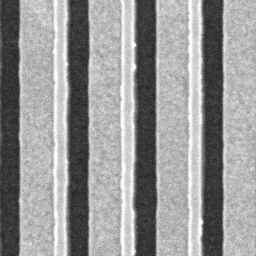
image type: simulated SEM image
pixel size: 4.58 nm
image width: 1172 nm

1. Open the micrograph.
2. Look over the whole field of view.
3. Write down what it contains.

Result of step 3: lines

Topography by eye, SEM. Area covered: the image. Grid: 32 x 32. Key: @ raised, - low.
---@@@@@---@@@@@@---@@@@@---@@@@
---@@@@@---@@@@@@---@@@@@---@@@@
---@@@@@---@@@@@@---@@@@@---@@@@
---@@@@@---@@@@@@---@@@@@---@@@@
--@@@@@@---@@@@@@---@@@@@---@@@@
--@@@@@@---@@@@@@---@@@@@---@@@@
---@@@@@---@@@@@@---@@@@@---@@@@
---@@@@@---@@@@@@---@@@@@---@@@@
--@@@@@@---@@@@@@---@@@@@---@@@@
--@@@@@@---@@@@@@---@@@@@---@@@@
---@@@@@---@@@@@@---@@@@@---@@@@
---@@@@@---@@@@@@---@@@@@---@@@@
---@@@@@---@@@@@@---@@@@@---@@@@
---@@@@@---@@@@@@---@@@@@---@@@@
---@@@@@---@@@@@@---@@@@@---@@@@
---@@@@@---@@@@@@---@@@@@---@@@@
--@@@@@@---@@@@@@---@@@@@---@@@@
--@@@@@@---@@@@@@---@@@@@---@@@@
---@@@@@---@@@@@@---@@@@@---@@@@
---@@@@@---@@@@@@---@@@@@---@@@@
---@@@@@---@@@@@@---@@@@@---@@@@
---@@@@@---@@@@@@---@@@@@---@@@@
---@@@@@---@@@@@@---@@@@@---@@@@
---@@@@@---@@@@@@---@@@@@---@@@@
--@@@@@@---@@@@@@---@@@@@---@@@@
--@@@@@@---@@@@@@---@@@@@---@@@@
---@@@@@---@@@@@@---@@@@@---@@@@
---@@@@@---@@@@@@---@@@@@---@@@@
---@@@@@---@@@@@@---@@@@@---@@@@
---@@@@@---@@@@@@---@@@@@---@@@@
---@@@@@---@@@@@@---@@@@@---@@@@
--@@@@@@---@@@@@@---@@@@@---@@@@